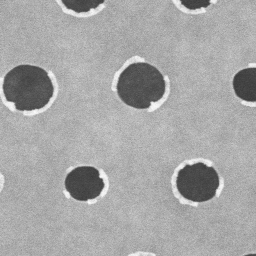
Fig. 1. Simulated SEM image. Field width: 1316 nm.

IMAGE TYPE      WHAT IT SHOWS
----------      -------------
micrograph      holes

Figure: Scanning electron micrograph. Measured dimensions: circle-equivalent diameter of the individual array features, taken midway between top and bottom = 43.9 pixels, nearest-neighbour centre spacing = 575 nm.